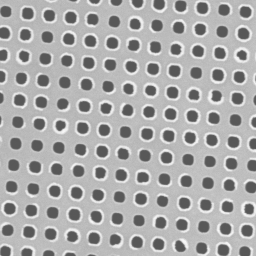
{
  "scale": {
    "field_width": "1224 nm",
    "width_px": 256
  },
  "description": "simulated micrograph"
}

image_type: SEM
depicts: a regular array of holes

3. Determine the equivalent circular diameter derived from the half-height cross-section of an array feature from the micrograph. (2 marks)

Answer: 0.0552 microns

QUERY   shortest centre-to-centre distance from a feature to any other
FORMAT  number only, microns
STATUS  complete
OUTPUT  0.103